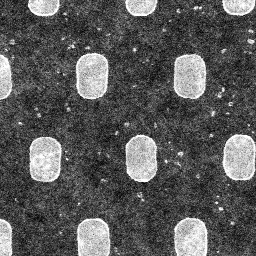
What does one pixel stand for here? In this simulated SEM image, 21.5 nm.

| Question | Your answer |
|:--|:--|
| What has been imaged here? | raised bodies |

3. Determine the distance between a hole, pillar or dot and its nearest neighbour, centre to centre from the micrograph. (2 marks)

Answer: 2050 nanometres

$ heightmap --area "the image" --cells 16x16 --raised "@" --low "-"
--@@----@@----@@
----------------
----------------
-----@----------
@----@@----@@---
@----@@----@@---
----------------
----------------
----------------
--@@----@@----@@
--@@----@@----@@
----------------
----------------
----------------
@----@@----@@---
@----@@----@@---